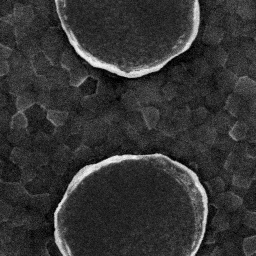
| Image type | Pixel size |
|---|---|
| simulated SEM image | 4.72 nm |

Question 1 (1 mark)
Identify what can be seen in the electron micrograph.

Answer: raised bodies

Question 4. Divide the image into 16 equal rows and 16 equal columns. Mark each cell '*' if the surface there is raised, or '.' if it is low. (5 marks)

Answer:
....********....
....********....
....********....
.....******.....
.......**.......
................
................
................
................
................
......*****.....
....********....
....*********...
...**********...
...**********...
....********....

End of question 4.